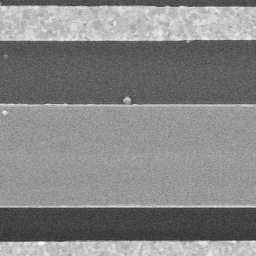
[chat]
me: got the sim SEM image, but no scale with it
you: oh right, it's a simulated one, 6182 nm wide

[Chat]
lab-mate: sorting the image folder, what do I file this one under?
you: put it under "lines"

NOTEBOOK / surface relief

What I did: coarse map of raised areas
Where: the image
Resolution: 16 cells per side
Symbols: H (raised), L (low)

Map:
HHHHHHHHHHHHHHHH
HHHHHHHHHHHHHHHH
HHHHHHHHHHHHLLLL
LLLLLLLLLLLLLLLL
LLLLLLLLLLLLLLLL
LLLLLLLLLLLLLLLL
LLLLLLLLLLLLLLLL
HHHHHHHHHHHHHHHH
HHHHHHHHHHHHHHHH
HHHHHHHHHHHHHHHH
HHHHHHHHHHHHHHHH
HHHHHHHHHHHHHHHH
HHHHHHHHHHHHHHHH
LLLLLLLLLLLLLLLL
LLLLLLLLLLLLLLLL
HHHHHHHHHHHHHHHH